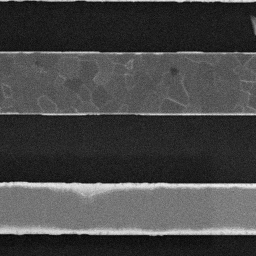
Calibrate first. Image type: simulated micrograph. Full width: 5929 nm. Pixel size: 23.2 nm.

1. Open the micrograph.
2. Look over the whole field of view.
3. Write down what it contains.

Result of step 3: lines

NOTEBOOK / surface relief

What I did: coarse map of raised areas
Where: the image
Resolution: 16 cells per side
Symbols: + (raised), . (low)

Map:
................
................
................
++++++++++++++++
++++++++++++++++
++++++++++++++++
++++++++++++++++
................
................
................
................
++..............
++++++++++++++++
++++++++++++++++
++++++++++++++++
................